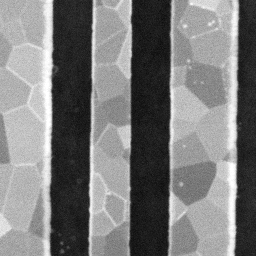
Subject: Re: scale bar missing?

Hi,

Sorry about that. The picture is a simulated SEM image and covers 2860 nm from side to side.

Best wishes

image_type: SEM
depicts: lines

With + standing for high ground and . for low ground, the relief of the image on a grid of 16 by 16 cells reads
+++...++...++++.
+++...++...++++.
+++...++...++++.
+++...++...++++.
+++...++...++++.
+++...++...++++.
+++...++...++++.
+++...++...++++.
+++...++...++++.
+++...++...++++.
+++...++...++++.
+++...++...++++.
+++...++...++++.
+++...++...++++.
+++...++...++++.
+++...++...++++.